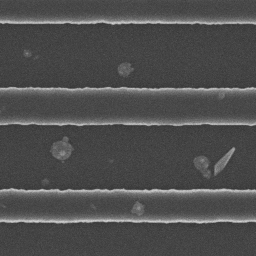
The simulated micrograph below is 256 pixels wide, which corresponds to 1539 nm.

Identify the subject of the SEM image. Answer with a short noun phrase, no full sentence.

lines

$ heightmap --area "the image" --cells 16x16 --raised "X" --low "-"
XXXXXXXXXXXXXXXX
-------------X-X
----------------
----------------
----------------
X-----X---------
XXXXXXXXXXXXXXXX
XXXXXXXXXXXXXXXX
----------------
----------------
----------------
----------------
XXXXXXXXXXXXXXXX
XXXXXXXXXXXXXXXX
----------------
----------------